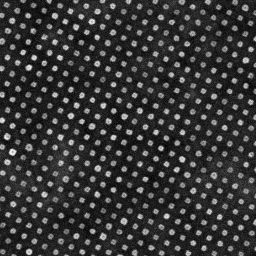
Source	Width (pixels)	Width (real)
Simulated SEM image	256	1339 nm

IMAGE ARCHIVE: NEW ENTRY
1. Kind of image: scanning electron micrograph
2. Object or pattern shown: a regular array of raised bodies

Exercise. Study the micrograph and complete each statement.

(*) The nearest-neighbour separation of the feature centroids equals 59.7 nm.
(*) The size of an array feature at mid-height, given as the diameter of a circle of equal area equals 4.91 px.